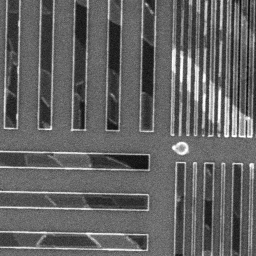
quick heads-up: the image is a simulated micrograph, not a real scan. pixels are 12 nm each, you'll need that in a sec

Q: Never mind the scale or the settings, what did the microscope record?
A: groups of lines, slits or small figures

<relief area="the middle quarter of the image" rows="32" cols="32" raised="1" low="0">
00111100000111000001110000010001
00111100000111000001110000010001
00111100000111000001110000010001
00111000000111000001110000010001
00111000000111000001110000010000
00111000000111000001110000010000
00111000000111000001110000000000
00111000000111000001110000000000
00111000000111000001110000000000
00111000000111000001110000000000
00111000000111000001110000000000
00111000000111000001110000000000
00111000000111000001110000000000
00111000000111000001110000000000
00111000000111000001110000000000
00111000000111000001110000000000
00000000000111000001110000000000
00000000000000000000000000000000
00000000000000000000000000000000
00000000000000000000000000000000
00000000000000000000000000001110
00000000000000000000000000001110
11111111111100000000000000000000
11111111111111111111100000000000
11111111111111111111100000000000
11111111111111111111100000001100
00000000000000000000100000001100
00000000000000000000000000001100
00000000000000000000000000001100
00000000000000000000000000001100
00000000000000000000000000001100
00000000000000000000000000001100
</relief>